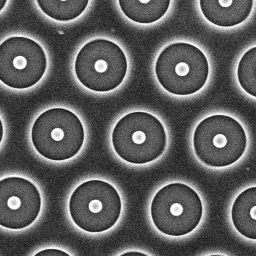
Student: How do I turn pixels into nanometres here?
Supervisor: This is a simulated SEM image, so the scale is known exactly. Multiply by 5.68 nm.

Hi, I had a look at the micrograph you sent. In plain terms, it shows an array of small figures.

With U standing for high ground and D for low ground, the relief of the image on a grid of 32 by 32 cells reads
DUUUUDDDDDDUUUUDDDDDDUUUUDDDUDDD
UUUUUDDDDDUUUUUDDDDDDUUUUDDDDDDU
UUUUUUUDDUUUUUUUDDDDUUUUUUDDDDDU
UUUUUUUUUUUUUUUUUUUUUUUUUUUUUUUU
UUUUUUUUUUUUUUUUUUUUUUUUUUUUUUUU
DDDDDUUUUUUDDDUUUUUUUDDDUUUUUUUU
DDDDDDUUUUDDDDDUUUUUDDDDDUUUUUUD
DDUDDDUUUDDDDDDDUUUUDDDDDDUUUUDD
DDUDDDUUUDDDUDDDUUUDDDUDDDUUUUDD
DDDDDUUUUUDDDDDDUUUUDDDDDDUUUUDD
UDDDUUUUUUDDDDDUUUUUDDDDDDUUUUDD
UUUUUUUUUUUUUUUUUUUUUDDDUUUUUUUD
UUUUUUUUUUUUUUUUUUUUUUUUUUUUUUUU
UUUUUUUUUUUUUUUUUUUUUUUUUUUUUUUU
UUUUUDDDDDUUUUUDDDDUUUUUUUDDDUUU
UUUUDDDDDDUUUUDDDDDDUUUUUDDDDDUU
UUUUDDDUDDUUUUDDDUDDDUUUDDDDDDDU
UUUUDDDDDDUUUUDDDUDDDUUUDDDUDDDU
UUUUDDDDDDUUUUDDDDDDDUUUDDDDDDDU
UUUUUDDDDUUUUUUDDDDDUUUUUDDDDDUU
UUUUUUUUUUUUUUUUUDUUUUUUUUDDDUUU
UUUUUUUUUUUUUUUUUUUUUUUUUUUUUUUU
DDDDUUUUUUUUUUUUUUUUUUUUUUUUUUUU
DDDDDUUUUUDDDDUUUUUUDDDDUUUUUUUD
DDDDDUUUUDDDDDDUUUUDDDDDDUUUUUDD
DUDDDUUUUDDUUDDUUUUDDDDDDUUUUDDD
DDDDDUUUUDDDDDDUUUUDDDUDDUUUUDDU
DDDDUUUUUDDDDDDUUUUDDDDDDUUUUDDD
UDDUUUUUUUDDDDUUUUUUDDDDUUUUUDDD
UUUUUUUUUUUUUUUUUUUUUUUUUUUUUUUD
UUUUUUUUUUUUUUUUUUUUUUUUUUUUUUUU
UUUUUDDDUUUUUUUUDDUUUUUUUUUUUUUU